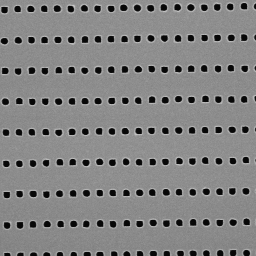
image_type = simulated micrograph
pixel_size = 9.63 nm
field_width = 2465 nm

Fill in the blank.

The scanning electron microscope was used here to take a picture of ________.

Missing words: a regular array of holes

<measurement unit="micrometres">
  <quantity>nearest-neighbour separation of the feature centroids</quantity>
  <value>0.125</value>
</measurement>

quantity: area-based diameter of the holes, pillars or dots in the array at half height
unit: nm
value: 67.9